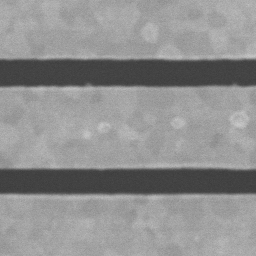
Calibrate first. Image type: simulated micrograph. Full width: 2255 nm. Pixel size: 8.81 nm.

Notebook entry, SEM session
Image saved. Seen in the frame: lines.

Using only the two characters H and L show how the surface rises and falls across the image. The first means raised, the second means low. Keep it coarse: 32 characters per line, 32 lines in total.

HHHHHHHHHHHHHHHHHHHHHHHHHHHHHHHH
HHHHHHHHHHHHHHHHHHHHHHHHHHHHHHHH
HHHHHHHHHHHHHHHHHHHHHHHHHHHHHHHH
HHHHHHHHHHHHHHHHHHHHHHHHHHHHHHHH
HHHHHHHHHHHHHHHHHHHHHHHHHHHHHHHH
HHHHHHHHHHHHHHHHHHHHHHHHHHHHHHHH
HHHHHHHHHHHHHHHHHHHHHHHHHHHHHHHH
LLLLLLLLLLLLLLLLLLLLLLLLLLLLLLLL
LLLLLLLLLLLLLLLLLLLLLLLLLLLLLLLL
LLLLLLLLLLLLLLLLLLLLLLLLLLLLLLLL
LLLLLLLLLLLLLLLLLLLLLLLLLLLLLLLL
HHHHHHHHHHHHHHHHHHHHHHHHHHHHHHHH
HHHHHHHHHHHHHHHHHHHHHHHHHHHHHHHH
HHHHHHHHHHHHHHHHHHHHHHHHHHHHHHHH
HHHHHHHHHHHHHHHHHHHHHHHHHHHHHHHH
HHHHHHHHHHHHHHHHHHHHHHHHHHHHHHHH
HHHHHHHHHHHHHHHHHHHHHHHHHHHHHHHH
HHHHHHHHHHHHHHHHHHHHHHHHHHHHHHHH
HHHHHHHHHHHHHHHHHHHHHHHHHHHHHHHH
HHHHHHHHHHHHHHHHHHHHHHHHHHHHHHHH
HHHHHHHHHHHHHHHHHHHHHHHHHHHHHHHH
LLLLLLLLLLLLLLLLLLLLLLLLLLLLLLLL
LLLLLLLLLLLLLLLLLLLLLLLLLLLLLLLL
LLLLLLLLLLLLLLLLLLLLLLLLLLLLLLLL
HHHHHHHHHHHHHHHHHHHHHHHHHHHHHHHH
HHHHHHHHHHHHHHHHHHHHHHHHHHHHHHHH
HHHHHHHHHHHHHHHHHHHHHHHHHHHHHHHH
HHHHHHHHHHHHHHHHHHHHHHHHHHHHHHHH
HHHHHHHHHHHHHHHHHHHHHHHHHHHHHHHH
HHHHHHHHHHHHHHHHHHHHHHHHHHHHHHHH
HHHHHHHHHHHHHHHHHHHHHHHHHHHHHHHH
HHHHHHHHHHHHHHHHHHHHHHHHHHHHHHHH